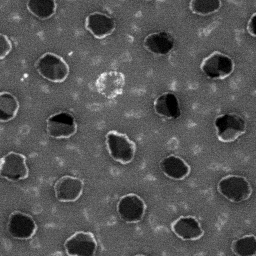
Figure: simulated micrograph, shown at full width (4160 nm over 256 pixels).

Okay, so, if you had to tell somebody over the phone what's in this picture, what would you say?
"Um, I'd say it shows a regular array of raised bodies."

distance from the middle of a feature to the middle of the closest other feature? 974 nanometers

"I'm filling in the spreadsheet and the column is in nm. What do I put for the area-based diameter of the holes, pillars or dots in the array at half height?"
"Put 460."